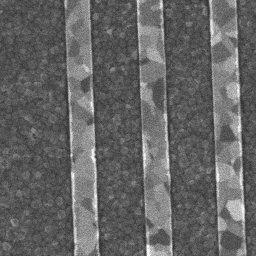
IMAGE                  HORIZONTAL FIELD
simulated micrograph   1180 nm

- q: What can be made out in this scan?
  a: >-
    one or a few lines or trenches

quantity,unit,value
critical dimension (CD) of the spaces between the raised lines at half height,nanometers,216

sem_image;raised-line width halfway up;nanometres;118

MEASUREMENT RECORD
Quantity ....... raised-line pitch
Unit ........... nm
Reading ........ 336